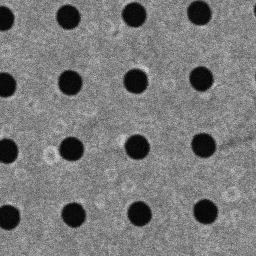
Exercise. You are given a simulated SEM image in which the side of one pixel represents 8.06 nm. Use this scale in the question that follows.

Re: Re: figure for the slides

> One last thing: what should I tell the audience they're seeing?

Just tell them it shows a regular array of holes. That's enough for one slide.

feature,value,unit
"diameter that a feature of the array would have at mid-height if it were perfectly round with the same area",199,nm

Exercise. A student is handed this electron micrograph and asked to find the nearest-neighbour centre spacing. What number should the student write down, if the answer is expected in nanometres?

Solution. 529